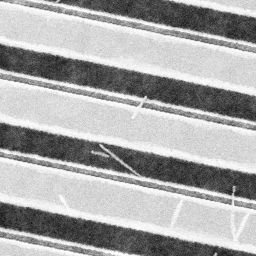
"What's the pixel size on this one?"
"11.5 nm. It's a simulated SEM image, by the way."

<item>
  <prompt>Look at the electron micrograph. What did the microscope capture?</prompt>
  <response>lines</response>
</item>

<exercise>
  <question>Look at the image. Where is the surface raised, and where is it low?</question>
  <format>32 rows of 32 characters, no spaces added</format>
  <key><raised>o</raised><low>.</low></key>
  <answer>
oooooo...................ooooooo
ooooooooooo...................oo
oooooooooooooooo................
ooooooooooooooooooooo...........
oooooooooooooooooooooooooo......
..ooooooooooooooooooooooooooooo.
.......ooooooooooooooooooooooooo
............oooooooooooooooooooo
.................ooooooooooooooo
ooo...................oooooooooo
ooooooo....................ooooo
oooooooooooo...................o
ooooooooooooooooo...............
oooooooooooooooooooooo..........
ooooooooooooooooooooooooooo.....
...ooooooooooooooooooooooooooooo
.......ooooooooooooooooooooooooo
............oooooooooooooooooooo
..................oooooooooooooo
ooo....................ooooooooo
oooooooo...................ooooo
ooooooooooooo...................
oooooooooooooooooo..............
ooooooooooooooooooooooo.........
oooooooooooooooooooooooooooo....
...ooooooooooooooooooooooooooooo
........oooooooooooooooooooooooo
.............ooooooooooooooooooo
..................oooooooooooooo
oooo..................oooooooooo
oooooooo...................ooooo
ooooooooooooo...................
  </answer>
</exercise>